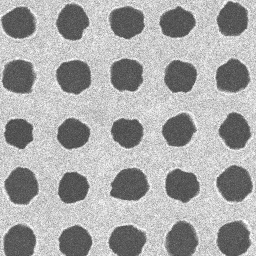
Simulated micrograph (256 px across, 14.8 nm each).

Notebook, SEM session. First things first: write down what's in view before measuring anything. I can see a regular array of holes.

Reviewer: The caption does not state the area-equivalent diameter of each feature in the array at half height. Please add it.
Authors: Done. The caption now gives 496 nm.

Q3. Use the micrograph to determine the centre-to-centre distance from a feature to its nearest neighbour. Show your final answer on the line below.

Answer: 777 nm